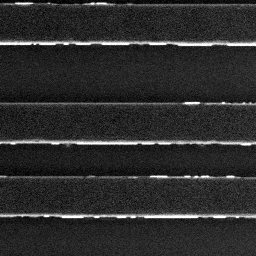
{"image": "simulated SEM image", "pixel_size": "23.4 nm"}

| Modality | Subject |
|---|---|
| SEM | lines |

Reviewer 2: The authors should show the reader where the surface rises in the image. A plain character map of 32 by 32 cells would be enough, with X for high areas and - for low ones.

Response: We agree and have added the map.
--------------------------------
XXXXXXXXXXXXXXXXXXXXXXXXXXXXXXXX
XXXXXXXXXXXXXXXXXXXXXXXXXXXXXXXX
XXXXXXXXXXXXXXXXXXXXXXXXXXXXXXXX
XXXXXXXXXXXXXXXXXXXXXXXXXXXXXXXX
-----------------------XXX---XXX
--------------------------------
--------------------------------
--------------------------------
--------------------------------
--------------------------------
--------------------------------
--------------------------------
XXXXXXXXXXXXXXXXXXXXXXXXXXXXXXXX
XXXXXXXXXXXXXXXXXXXXXXXXXXXXXXXX
XXXXXXXXXXXXXXXXXXXXXXXXXXXXXXXX
XXXXXXXXXXXXXXXXXXXXXXXXXXXXXXXX
XXXXXXXXXXXXXXXXXXXXXXXXXXXXXXXX
--------------------------------
--------------------------------
--------------------------------
--------------------------------
XXXXXXXXXXXXXXXXXXXXXXXXXXXXXXXX
XXXXXXXXXXXXXXXXXXXXXXXXXXXXXXXX
XXXXXXXXXXXXXXXXXXXXXXXXXXXXXXXX
XXXXXXXXXXXXXXXXXXXXXXXXXXXXXXXX
XXXXXXXXXXXXXXXXXXXXXXXXXXXXXXXX
--------------------------------
--------------------------------
--------------------------------
--------------------------------
--------------------------------